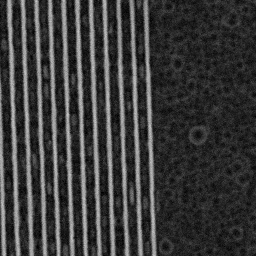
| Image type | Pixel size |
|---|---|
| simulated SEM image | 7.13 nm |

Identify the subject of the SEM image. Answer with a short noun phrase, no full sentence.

parallel lines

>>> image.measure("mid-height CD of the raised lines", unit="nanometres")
26.7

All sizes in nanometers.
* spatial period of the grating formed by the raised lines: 96.9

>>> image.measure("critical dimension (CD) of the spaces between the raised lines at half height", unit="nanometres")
73.9